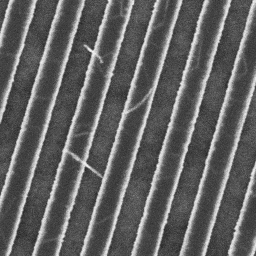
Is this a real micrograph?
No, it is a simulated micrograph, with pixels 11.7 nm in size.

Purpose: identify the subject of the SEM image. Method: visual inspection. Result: lines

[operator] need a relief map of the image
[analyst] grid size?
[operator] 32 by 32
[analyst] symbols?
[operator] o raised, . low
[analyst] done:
.ooo...ooo....ooo...ooo...ooo...
.ooo...ooo...ooo...ooo...ooo...o
.ooo...ooo...ooo...ooo...ooo...o
ooo...oooo...ooo...ooo...ooo...o
ooo...ooo...ooo...ooo...ooo....o
ooo...ooo...ooo...ooo...ooo...oo
ooo...ooo...ooo...ooo...ooo...oo
oo...ooo....oo...ooo....ooo...oo
oo...ooo...ooo...ooo...ooo...ooo
oo...ooo...ooo...ooo...ooo...ooo
o...ooo....ooo...ooo...ooo...ooo
o...ooo...ooo...ooo...ooo...oooo
o...ooo...ooo...ooo...ooo...ooo.
....oo....ooo...ooo...ooo...ooo.
...ooo...ooo...ooo....ooo...ooo.
...ooo...ooo...ooo...ooo...ooo..
...ooo...ooo...ooo...ooo...ooo..
..ooo...ooo...ooo....ooo...ooo..
..ooo...ooo...ooo...ooo...ooo...
..ooo...ooo...ooo...ooo...ooo...
.ooo....ooo...ooo...ooo...ooo...
.ooo...ooo...ooo....oo....oo....
.ooo...ooo...ooo...ooo...ooo...o
.ooo...ooo...ooo...ooo...ooo...o
ooo...ooo...ooo....ooo...ooo...o
ooo...ooo...ooo...ooo...ooo....o
ooo...ooo...ooo...ooo...ooo...oo
oo...ooo....oo....ooo...ooo...oo
oo...ooo...ooo....oo....oo....oo
oo...ooo...ooo...ooo...ooo...ooo
oo...ooo...ooo...ooo...ooo...ooo
o...ooo...ooo....ooo...ooo...ooo